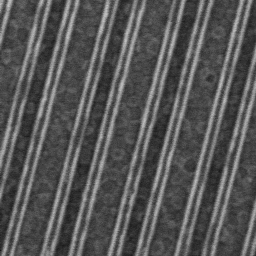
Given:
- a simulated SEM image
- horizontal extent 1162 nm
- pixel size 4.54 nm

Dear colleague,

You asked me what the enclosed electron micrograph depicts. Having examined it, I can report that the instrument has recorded parallel lines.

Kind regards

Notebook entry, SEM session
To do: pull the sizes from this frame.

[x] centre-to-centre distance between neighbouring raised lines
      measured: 146 nanometers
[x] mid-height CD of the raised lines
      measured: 47.2 nanometres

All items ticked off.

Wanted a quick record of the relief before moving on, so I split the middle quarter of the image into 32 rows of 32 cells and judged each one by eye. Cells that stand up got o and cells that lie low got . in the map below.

.......oo....ooo.......ooo....oo
......ooo....ooo.......ooo....oo
......ooo....oo........oo....ooo
......ooo....oo.......ooo....ooo
......oo....ooo.......ooo....ooo
.....ooo....ooo.......ooo....ooo
.....ooo....oo........oo....ooo.
.....oo.....oo.......ooo....ooo.
.....oo....ooo.......ooo....ooo.
....ooo....ooo.......ooo....oo..
....ooo....oo........oo.....oo..
....oo.....oo.......ooo....ooo..
....oo....ooo.......ooo....oo...
...ooo....ooo.......ooo....oo...
...oo.....oo........oo.....oo...
...oo.....oo.......ooo....ooo...
...oo....ooo.......ooo....oo....
..ooo....ooo.......oo.....oo....
..oo.....oo........oo.....oo....
..oo....ooo.......ooo....ooo....
..oo....ooo.......ooo....oo.....
.ooo....ooo.......oo.....oo.....
.oo.....oo........oo.....oo.....
.oo....ooo.......ooo....ooo.....
ooo....ooo.......ooo....oo......
ooo....ooo.......oo.....oo......
ooo....oo........oo....ooo......
oo....ooo.......ooo....ooo......
oo....ooo.......ooo....oo.......
oo....ooo.......oo.....oo.......
oo....oo........oo....ooo.......
o....ooo.......ooo....ooo.......